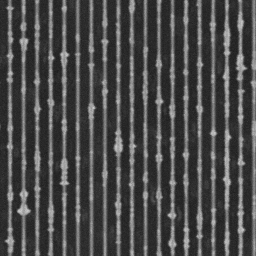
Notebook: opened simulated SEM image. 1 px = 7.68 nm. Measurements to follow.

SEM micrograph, parallel lines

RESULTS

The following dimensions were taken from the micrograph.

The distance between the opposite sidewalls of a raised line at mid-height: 0.0259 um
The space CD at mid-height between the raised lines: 77.8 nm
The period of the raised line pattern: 0.104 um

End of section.